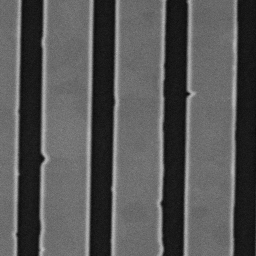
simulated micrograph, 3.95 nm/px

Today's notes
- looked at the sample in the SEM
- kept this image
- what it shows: one or a few lines or trenches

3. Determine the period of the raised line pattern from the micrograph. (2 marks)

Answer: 285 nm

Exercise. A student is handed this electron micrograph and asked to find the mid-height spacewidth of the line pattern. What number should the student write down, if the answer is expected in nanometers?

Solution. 101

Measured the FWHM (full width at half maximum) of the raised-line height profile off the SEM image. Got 185 nm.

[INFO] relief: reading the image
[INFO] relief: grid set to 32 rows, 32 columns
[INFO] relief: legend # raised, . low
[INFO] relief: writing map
##....#####....######...#####...
##....#####....#####....#####...
##....#####....#####....#####...
##....#####....#####....#####...
##....#####....#####....#####...
##...######....#####....#####...
##....#####....#####....#####...
##....#####....#####....#####...
##....#####....#####....#####...
##....#####....#####....#####...
##...######....#####....#####...
##...######....#####....#####...
##...######....#####....#####...
##...######...######....#####...
##....#####...######....#####...
##....#####...######...######...
##....#####...######....#####...
##...######...######...######...
##...######...######...######...
##....#####...######...######...
##....#####...######...######...
##...######...######...######...
##...######...######...######...
##...######...######...######...
##...######...######...######...
##...######...######...######...
##...######...######...######...
##...######...######...######...
##...######...######...######...
##...######...######...######...
##...######...######...######...
##...######...######...######...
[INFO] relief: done